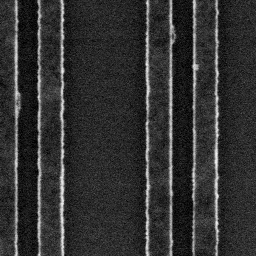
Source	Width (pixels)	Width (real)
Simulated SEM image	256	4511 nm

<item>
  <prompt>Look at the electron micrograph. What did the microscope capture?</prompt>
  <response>lines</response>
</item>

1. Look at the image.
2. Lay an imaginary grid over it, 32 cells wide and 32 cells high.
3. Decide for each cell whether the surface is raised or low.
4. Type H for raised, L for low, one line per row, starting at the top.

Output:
HHLLLHHHLLLLLLLLLLHHHLLLHHHLLLLL
HHLLLHHHLLLLLLLLLLHHHLLLHHHLLLLL
HHLLLHHHLLLLLLLLLLHHHLLLHHHLLLLL
HHLLLHHHLLLLLLLLLLHHHLLLHHHLLLLL
HHLLLHHHLLLLLLLLLLHHHLLLHHHLLLLL
HHLLLHHHLLLLLLLLLLHHHLLLHHHLLLLL
HHLLLHHHLLLLLLLLLLHHHLLLHHHLLLLL
HHLLLHHHLLLLLLLLLLHHHLLLHHHLLLLL
HHLLLHHHLLLLLLLLLLHHHLLLHHHLLLLL
HHLLLHHHLLLLLLLLLLHHHLLLHHHLLLLL
HHLLLHHHLLLLLLLLLLHHHLLLHHHLLLLL
HHLLLHHHLLLLLLLLLLHHHLLLHHHLLLLL
HHLLLHHHLLLLLLLLLLHHHLLLHHHLLLLL
HHLLLHHHLLLLLLLLLLHHHLLLHHHLLLLL
HHLLLHHHLLLLLLLLLLHHHLLLHHHLLLLL
HHLLLHHHLLLLLLLLLLHHHLLLHHHLLLLL
HHLLLHHHLLLLLLLLLLHHHLLLHHHLLLLL
HHLLLHHHLLLLLLLLLLHHHLLLHHHLLLLL
HHLLLHHHLLLLLLLLLLHHHLLLHHHLLLLL
HHLLLHHHLLLLLLLLLLHHHLLLHHHLLLLL
HHLLLHHHLLLLLLLLLLHHHLLLHHHLLLLL
HHLLLHHHLLLLLLLLLLHHHLLLHHHLLLLL
HHLLLHHHLLLLLLLLLLHHHLLLHHHLLLLL
HHLLLHHHLLLLLLLLLLHHHLLLHHHLLLLL
HHLLLHHHLLLLLLLLLLHHHLLLHHHLLLLL
HHLLLHHHLLLLLLLLLLHHHLLLHHHLLLLL
HHLLLHHHLLLLLLLLLLHHHLLLHHHLLLLL
HHLLLHHHLLLLLLLLLLHHHLLLHHHLLLLL
HHLLLHHHLLLLLLLLLLHHHLLLHHHLLLLL
HHLLLHHHLLLLLLLLLLHHHLLLHHHLLLLL
HHLLLHHHLLLLLLLLLLHHHLLLHHHLLLLL
HHLLLHHHLLLLLLLLLLHHHLLLHHHLLLLL